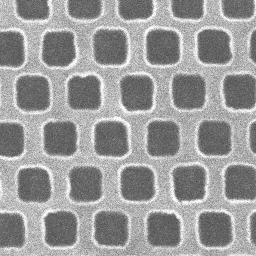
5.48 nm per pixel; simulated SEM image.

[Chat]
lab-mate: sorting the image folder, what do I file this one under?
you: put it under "a regular array of holes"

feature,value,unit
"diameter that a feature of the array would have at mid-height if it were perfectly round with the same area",0.197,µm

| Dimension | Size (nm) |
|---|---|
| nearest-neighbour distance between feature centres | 280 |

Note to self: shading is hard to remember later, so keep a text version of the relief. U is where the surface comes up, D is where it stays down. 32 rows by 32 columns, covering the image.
UUDDDDUUDDDDDUUDDDDUUDDDDDUUDDDD
UUDDDDUUUDDDDUUDDDDUUUDDDUUUDDDD
UUUUUUUUUUUUUUUUUUUUUUUUUUUUUUUU
UUUUUUUUUUUUUUUUUUUUUUUUUUUUUUUU
DDDUUUDDDUUUDDDDUUDDDDUUUDDDDUUD
DDDUUDDDDUUUDDDDUUDDDDUUUDDDDUUD
DDDUUDDDDUUUDDDDUUDDDDUUUDDDDUUD
DDDUUDDDDUUUDDDDUUUDDDUUUDDDDUUU
UUUUUUUUUUUUUUUUUUUUUUUUUUUUUUUU
UUUDUUUUUUUDUUUUDDUUUUDDDUUUUDDU
UUDDDDUUUDDDDUUDDDDUUUDDDDUUDDDD
UUDDDDUUDDDDDUUDDDDUUUDDDDUUDDDD
UUDDDDUUUDDDDUUDDDDUUUDDDDUUDDDD
UUDDDDUUUDDDUUUUDDDUUUDDDUUUUDDU
UUUUUUUUUUUUUUUUUUUUUUUUUUUUUUUU
DDUUUUDDDUUUDDDUUUUDDDUUUDDDUUUU
DDDUUDDDDDUUDDDDUUDDDDUUUDDDDUUD
DDDUUDDDDDUUDDDDUUDDDDUUUDDDDUUD
DDDUUUDDDDUUDDDDUUDDDDUUUDDDDUUD
DDUUUUUUUUUUUDDUUUUDDUUUUUUUUUUU
UUUUUUUUUUUUUUUUUUUUUUUUUUUUUUUU
UUDDDDUUUDDDDUUDDDDUUUDDDDUUDDDD
UUDDDDUUUDDDDUUDDDDUUUDDDDUUDDDD
UUDDDDUUUDDDDUUDDDDUUUDDDDUUDDDD
UUDDDDUUUDDDDUUDDDDUUUDDDUUUDDDD
UUUUUUUUUUUUUUUUUUUUUUUUUUUUUUUU
UUUUUUUDDUUUDDDUUUUUUUUUUUDDUUUU
DDDUUUDDDDUUDDDDUUDDDDUUUDDDDUUD
DDDUUUDDDDUUDDDDUUDDDDDUUDDDDUUD
DDDUUUDDDDUUDDDDUUDDDDDUUDDDDUUD
DDDUUUDDDUUUDDDUUUUDDDUUUUDDUUUU
UUUUUUUUUUUUUUUUUUUUUUUUUUUUUUUU